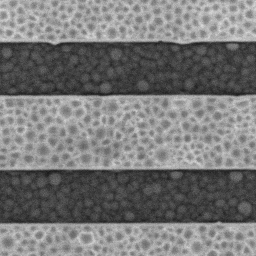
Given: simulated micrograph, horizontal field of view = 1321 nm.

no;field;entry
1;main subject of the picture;one or a few lines or trenches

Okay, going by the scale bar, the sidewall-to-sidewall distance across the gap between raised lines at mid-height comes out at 287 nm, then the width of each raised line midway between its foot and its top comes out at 374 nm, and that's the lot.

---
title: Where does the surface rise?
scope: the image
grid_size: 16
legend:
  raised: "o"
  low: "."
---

oooooooooooooooo
oooooooooooooooo
ooooooooooooooo.
................
................
................
oooooooooooooooo
oooooooooooooooo
oooooooooooooooo
oooooooooooooooo
ooooooooooooooo.
................
................
................
oooooooooooooooo
oooooooooooooooo